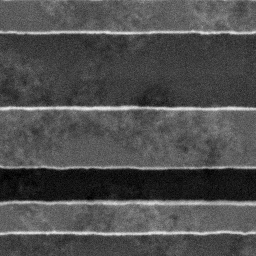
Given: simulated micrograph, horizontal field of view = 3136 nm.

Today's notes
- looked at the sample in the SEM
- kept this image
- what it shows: lines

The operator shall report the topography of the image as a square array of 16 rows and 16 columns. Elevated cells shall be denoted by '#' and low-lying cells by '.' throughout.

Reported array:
################
################
................
................
................
................
................
################
################
################
...####.######.#
................
................
################
################
................